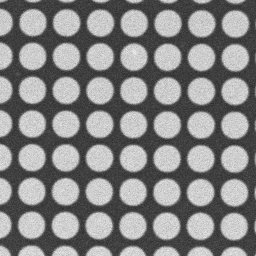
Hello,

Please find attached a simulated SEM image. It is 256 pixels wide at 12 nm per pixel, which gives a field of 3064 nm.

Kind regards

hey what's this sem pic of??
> an array of small figures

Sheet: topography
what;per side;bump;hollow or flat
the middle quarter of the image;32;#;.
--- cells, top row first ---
###....#####...#####...#####....
........##.......#.......##.....
................................
##......##......###......#......
###...######...#####...#####....
####..######..######...######..#
####..######..#######..######..#
####..######..#######..######..#
###...######...#####...######...
##.....####.....###.....####....
................................
................................
###....####....####.....####....
###...######...#####...#####....
####..######..#######..######..#
####..######..#######..######..#
####..######..######...######..#
###....####....#####....####....
................................
................................
##......##......###.....###.....
###...#####....#####...#####....
####..######..######...######..#
####..######..######...######..#
####..######..######...######..#
###...######...#####...#####...#
##.....###......###.....###.....
................................
................................
###....####....####.....####....
###...######..######...######..#
####..######..######...######..#